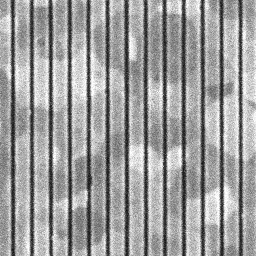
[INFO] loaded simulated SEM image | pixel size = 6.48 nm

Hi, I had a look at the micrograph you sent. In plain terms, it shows parallel lines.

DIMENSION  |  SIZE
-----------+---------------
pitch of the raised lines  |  123 nm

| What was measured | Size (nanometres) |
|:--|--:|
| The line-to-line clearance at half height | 31.6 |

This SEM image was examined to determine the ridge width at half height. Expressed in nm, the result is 89.1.